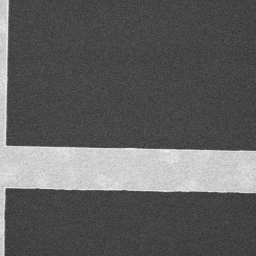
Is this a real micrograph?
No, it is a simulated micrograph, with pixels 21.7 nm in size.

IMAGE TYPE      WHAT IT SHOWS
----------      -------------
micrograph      one or a few lines or trenches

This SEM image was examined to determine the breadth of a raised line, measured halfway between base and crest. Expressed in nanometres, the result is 894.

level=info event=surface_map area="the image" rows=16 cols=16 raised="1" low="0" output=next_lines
0000000000000000
0000000000000000
0000000000000000
0000000000000000
0000000000000000
0000000000000000
0000000000000000
0000000000000000
0000000000000000
1111111111111111
1111111111111111
1111111111111111
0000000000000000
0000000000000000
0000000000000000
0000000000000000